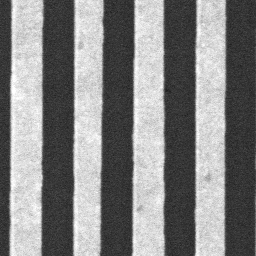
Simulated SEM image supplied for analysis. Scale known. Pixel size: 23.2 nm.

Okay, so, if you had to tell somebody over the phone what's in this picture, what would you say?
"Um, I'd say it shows lines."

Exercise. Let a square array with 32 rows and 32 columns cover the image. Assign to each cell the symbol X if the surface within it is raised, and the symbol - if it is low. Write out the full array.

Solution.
--XXX----XXXX----XXX-----XXX----
--XXX----XXXX----XXX-----XXX----
--XXX----XXXX----XXX-----XXX----
--XXX----XXXX----XXX-----XXX----
--XXX----XXXX----XXX-----XXX----
--XXX----XXXX----XXX-----XXX----
--XXX----XXXX----XXX-----XXX----
--XXX----XXXX----XXX-----XXX----
--XXX----XXXX----XXX-----XXX----
--XXX----XXXX----XXX-----XXX----
--XXX----XXXX----XXX-----XXX----
--XXX----XXXX----XXX-----XXX----
--XXX----XXXX----XXX-----XXX----
--XXX----XXXX----XXX-----XXX----
--XXX----XXXX----XXX-----XXX----
-XXXX----XXXX----XXX-----XXX----
--XXX----XXXX----XXX-----XXX----
-XXXX----XXXX----XXX-----XXX----
-XXXX----XXXX----XXX-----XXX----
-XXXX----XXX-----XXX-----XXX----
-XXXX----XXXX----XXX-----XXX----
-XXXX----XXX-----XXX-----XXX----
-XXXX----XXX-----XXX-----XXX----
-XXXX----XXX-----XXX-----XXX----
-XXXX----XXX-----XXX-----XXX----
-XXXX----XXX-----XXX-----XXX----
-XXXX----XXX-----XXX-----XXX----
-XXXX----XXX-----XXX-----XXX----
-XXXX----XXX-----XXX-----XXX----
-XXXX----XXX-----XXX-----XXX----
-XXXX----XXX-----XXX-----XXX----
-XXXX----XXX-----XXX-----XXX----